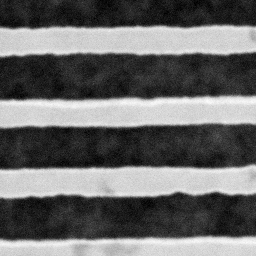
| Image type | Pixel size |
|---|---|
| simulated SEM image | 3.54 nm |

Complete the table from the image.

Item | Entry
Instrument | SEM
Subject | lines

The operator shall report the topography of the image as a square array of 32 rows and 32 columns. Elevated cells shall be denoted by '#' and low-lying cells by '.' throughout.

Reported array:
................................
................................
................................
......###......#######..########
################################
################################
###############################.
................................
................................
................................
................................
................................
....................############
################################
################################
########################........
................................
................................
................................
................................
................................
################################
################################
################################
######.....#....................
................................
................................
................................
................................
................................
################################
################################